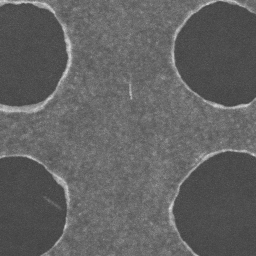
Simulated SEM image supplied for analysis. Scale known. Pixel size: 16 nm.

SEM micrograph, holes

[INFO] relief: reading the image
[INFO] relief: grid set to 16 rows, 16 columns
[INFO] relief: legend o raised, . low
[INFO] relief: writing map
...oooooooooo..o
....ooooooo.....
....ooooooo.....
....ooooooo.....
....ooooooo.....
....oooooooo....
...ooooooooooo.o
oooooooooooooooo
oooooooooooooooo
oooooooooooooo.o
...ooooooooo....
....ooooooo.....
....ooooooo.....
....ooooooo.....
....ooooooo.....
...ooooooooo....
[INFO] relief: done